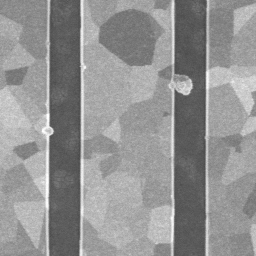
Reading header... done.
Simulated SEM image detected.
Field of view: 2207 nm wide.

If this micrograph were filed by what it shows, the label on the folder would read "one or a few lines or trenches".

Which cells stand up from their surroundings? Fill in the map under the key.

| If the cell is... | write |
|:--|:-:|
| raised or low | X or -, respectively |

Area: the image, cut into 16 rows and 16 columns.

XXX--XXXXXX--XXX
XXX--XXXXXX--XXX
XXX--XXXXXX--XXX
XXX--XXXXXX--XXX
XXX--XXXXXX--XXX
XXX--XXXXXX--XXX
XXX--XXXXXX--XXX
XXX--XXXXXX--XXX
XXX--XXXXXX--XXX
XXX--XXXXXX--XXX
XXX--XXXXXX--XXX
XXX--XXXXXX--XXX
XXX--XXXXXX--XXX
XXX--XXXXXX--XXX
XXX--XXXXXX--XXX
XXX--XXXXXX--XXX